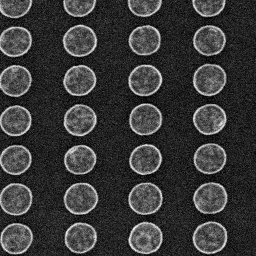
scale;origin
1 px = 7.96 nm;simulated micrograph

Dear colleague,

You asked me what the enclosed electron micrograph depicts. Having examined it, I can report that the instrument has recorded a regular array of raised bodies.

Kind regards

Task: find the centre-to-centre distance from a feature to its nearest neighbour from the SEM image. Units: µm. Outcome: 0.313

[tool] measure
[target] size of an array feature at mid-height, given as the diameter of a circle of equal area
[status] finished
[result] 248 nm